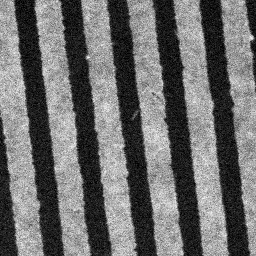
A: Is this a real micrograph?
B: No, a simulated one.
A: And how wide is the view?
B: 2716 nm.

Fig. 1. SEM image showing parallel lines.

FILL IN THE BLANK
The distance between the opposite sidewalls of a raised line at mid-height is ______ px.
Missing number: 24.1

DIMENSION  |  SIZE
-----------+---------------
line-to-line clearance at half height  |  233 nm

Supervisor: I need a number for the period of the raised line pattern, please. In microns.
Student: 0.488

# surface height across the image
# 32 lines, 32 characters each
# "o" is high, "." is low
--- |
oo..ooo...ooo...ooo...ooo...ooo.
oo...ooo..ooo...ooo...ooo...ooo.
oo...ooo..oooo..ooo...ooo...ooo.
oo...ooo...ooo..ooo...ooo...ooo.
oo...ooo...ooo...oo...ooo...ooo.
oo...ooo...ooo...ooo..ooo...ooo.
oo...ooo...ooo...ooo...ooo..ooo.
oo...ooo...ooo...ooo...ooo..ooo.
ooo..ooo...ooo...ooo...ooo..oooo
ooo..oooo..ooo...ooo...ooo...ooo
ooo...ooo..ooo...ooo...ooo...ooo
ooo...ooo...ooo..ooo...ooo...ooo
ooo...ooo...ooo..oooo..ooo...ooo
ooo...ooo...ooo...ooo..oooo..ooo
ooo...ooo...ooo...ooo...ooo..ooo
oooo..ooo...ooo...ooo...ooo..ooo
.ooo..ooo...ooo...ooo...ooo..ooo
.ooo...oo...ooo...ooo...ooo...oo
.ooo...oo...ooo...ooo...ooo...oo
.ooo...ooo..oooo..ooo...ooo...oo
.ooo...ooo...ooo..ooo...ooo...oo
.ooo...ooo...ooo...ooo..ooo...oo
.ooo...ooo...ooo...ooo..ooo...oo
.ooo...ooo...ooo...ooo...ooo..oo
..ooo..ooo...ooo...ooo...ooo..oo
..ooo..ooo...ooo...ooo...ooo...o
..ooo..ooo...ooo...ooo...ooo...o
..ooo...oo...ooo...ooo...ooo...o
..ooo...ooo...ooo..ooo...ooo...o
..ooo...ooo...ooo..oooo..ooo...o
..ooo...ooo...ooo...ooo..ooo...o
..ooo...ooo...ooo...ooo..ooo...o